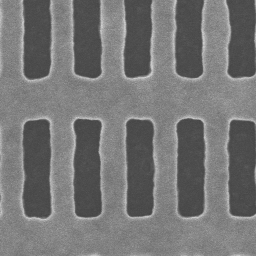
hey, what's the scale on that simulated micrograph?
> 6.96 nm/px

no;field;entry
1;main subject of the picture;holes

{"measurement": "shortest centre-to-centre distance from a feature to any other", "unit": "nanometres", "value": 353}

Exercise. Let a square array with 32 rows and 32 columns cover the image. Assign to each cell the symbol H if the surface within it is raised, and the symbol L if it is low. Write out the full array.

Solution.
HHHLLLHHHLLLLHHHLLLHHHLLLHHHLLLL
HHHLLLHHHLLLLHHHLLLHHHLLLHHHHLLL
HHHLLLHHHLLLLHHHLLLHHHLLLHHHHLLL
HHHLLLHHHLLLHHHHLLLHHHLLLHHHHLLL
HHHLLLHHHLLLLHHHLLLHHHLLLHHHHLLL
HHHLLLHHHLLLLHHHLLLHHHLLLHHHHLLL
HHHLLLHHHLLLLHHHLLLHHHLLLHHHHLLL
HHHLLLHHHLLLLHHHLLLHHHLLLHHHHLLL
HHHLLLHHHLLLLHHHLLLHHHLLLHHHHLLL
HHHLLLHHHHLLHHHHLLHHHHHLLHHHHLLH
HHHHHHHHHHHHHHHHHHHHHHHHHHHHHHHH
HHHHHHHHHHHHHHHHHHHHHHHHHHHHHHHH
HHHHHHHHHHHHHHHHHHHHHHHHHHHHHHHH
HHHHHHHHHHHHHHHHHHHHHHHHHHHHHHHH
HHHHHHHHHHHHHHHHHHHHHHHHHHHHHHHH
HHHLLLHHHLLLLHHHLLLHHHLLLHHHHLLL
HHHLLLHHHLLLLHHHLLLHHHLLLLHHHLLL
HHHLLLHHHHLLHHHHLLLHHHLLLLHHHLLL
HHHLLLHHHLLLHHHHLLLHHHLLLLHHLLLL
HHHLLLHHHLLLHHHHLLLHHHLLLHHHHLLL
HHHLLLHHHLLLLHHHLLLHHHLLLHHHHLLL
HHHLLLHHHLLLLHHHLLLHHHLLLLHHHLLL
HHHLLLHHHLLLLHHHLLLHHHLLLLHHHLLL
HHHLLLHHHLLLLHHHLLLHHHLLLLHHLLLL
HHHLLLHHHLLLLHHHLLLHHHLLLLHHHLLL
HHHLLLHHHLLLLHHHLLLHHHLLLLHHHLLL
HHHLLLHHHLLLLHHHLLLHHHLLLHHHHLLL
HHHHHHHHHHHHHHHHHHHHHHHHHHHHHHHH
HHHHHHHHHHHHHHHHHHHHHHHHHHHHHHHH
HHHHHHHHHHHHHHHHHHHHHHHHHHHHHHHH
HHHHHHHHHHHHHHHHHHHHHHHHHHHHHHHH
HHHHHHHHHHHHHHHHHHHHHHHHHHHHHHHH